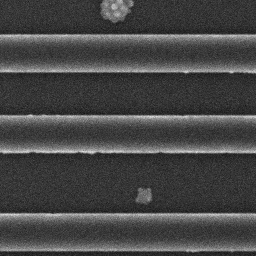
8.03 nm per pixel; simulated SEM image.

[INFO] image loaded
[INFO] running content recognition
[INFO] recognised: lines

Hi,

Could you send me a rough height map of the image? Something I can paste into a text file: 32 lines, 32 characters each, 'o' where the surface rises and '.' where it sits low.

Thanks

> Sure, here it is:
.............ooo................
.............ooo................
................................
................................
oooooooooooooooooooooooooooooooo
oooooooooooooooooooooooooooooooo
oooooooooooooooooooooooooooooooo
oooooooooooooooooooooooooooooooo
oooooooooooooooooooooooooooooooo
................................
................................
................................
................................
................................
...o.o..........................
oooooooooooooooooooooooooooooooo
oooooooooooooooooooooooooooooooo
oooooooooooooooooooooooooooooooo
oooooooooooooooooooooooooooooooo
................................
................................
................................
................................
................................
................................
................................
................................
oooooooooooooooooooooooooooooooo
oooooooooooooooooooooooooooooooo
oooooooooooooooooooooooooooooooo
oooooooooooooooooooooooooooooooo
................................